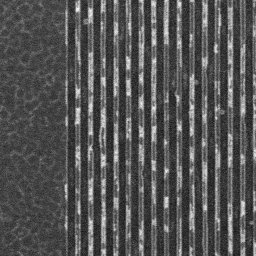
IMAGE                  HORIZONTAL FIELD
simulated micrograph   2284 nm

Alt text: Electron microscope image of parallel lines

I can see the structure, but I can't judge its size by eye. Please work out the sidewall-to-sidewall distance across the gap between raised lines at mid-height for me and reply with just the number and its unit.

0.0725 micrometres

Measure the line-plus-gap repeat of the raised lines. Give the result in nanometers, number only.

113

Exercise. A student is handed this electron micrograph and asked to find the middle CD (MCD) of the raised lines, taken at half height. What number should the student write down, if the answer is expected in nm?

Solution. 36.8